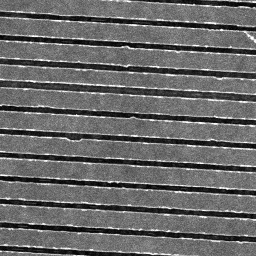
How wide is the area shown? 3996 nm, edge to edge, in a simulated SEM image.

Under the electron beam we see parallel lines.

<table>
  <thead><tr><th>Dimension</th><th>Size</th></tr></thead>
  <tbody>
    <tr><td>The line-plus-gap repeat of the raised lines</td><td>365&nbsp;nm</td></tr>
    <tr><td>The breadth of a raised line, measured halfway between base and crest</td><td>0.278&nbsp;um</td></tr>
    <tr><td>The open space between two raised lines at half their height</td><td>87.6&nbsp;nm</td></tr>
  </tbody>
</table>